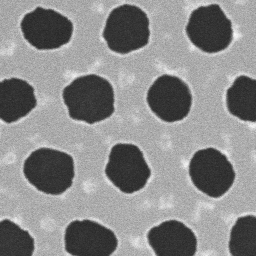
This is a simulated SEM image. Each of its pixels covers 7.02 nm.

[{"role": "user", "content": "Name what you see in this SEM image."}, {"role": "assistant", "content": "a regular array of holes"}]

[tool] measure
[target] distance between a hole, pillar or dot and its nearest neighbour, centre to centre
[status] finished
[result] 559 nm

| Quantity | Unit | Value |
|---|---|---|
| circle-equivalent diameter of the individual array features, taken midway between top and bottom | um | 0.333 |